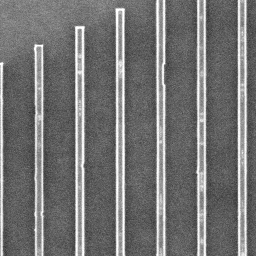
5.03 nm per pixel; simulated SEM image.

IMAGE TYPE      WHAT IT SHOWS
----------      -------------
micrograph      parallel lines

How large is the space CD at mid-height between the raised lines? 166 nanometres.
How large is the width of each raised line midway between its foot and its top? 38.3 nm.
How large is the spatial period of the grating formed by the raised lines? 0.204 micrometres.